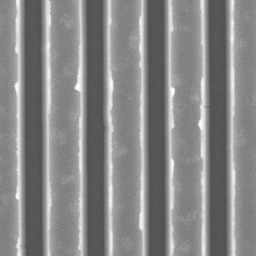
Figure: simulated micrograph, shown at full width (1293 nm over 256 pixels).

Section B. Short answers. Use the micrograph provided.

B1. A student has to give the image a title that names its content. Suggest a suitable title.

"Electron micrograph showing one or a few lines or trenches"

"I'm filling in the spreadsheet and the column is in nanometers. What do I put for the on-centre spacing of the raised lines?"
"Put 309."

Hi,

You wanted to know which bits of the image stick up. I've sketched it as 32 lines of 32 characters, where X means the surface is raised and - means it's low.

XXX---XXXX---XXXXX---XXXXX---XXX
XXX---XXXX---XXXXX---XXXXX---XXX
XXX---XXXX---XXXXX---XXXXX---XXX
XXX---XXXX---XXXXX---XXXXX---XXX
XXX---XXXX---XXXXX---XXXXX---XXX
XXX---XXXX---XXXXX---XXXXX---XXX
XXX---XXXX---XXXXX---XXXXX---XXX
XXX---XXXX---XXXXX---XXXXX---XXX
XXX---XXXX---XXXXX---XXXXX---XXX
XXX---XXXX---XXXXX---XXXXX---XXX
XXX---XXXX---XXXXX---XXXXX---XXX
XXX---XXXX---XXXXX---XXXXX---XXX
XXX---XXXX---XXXXX---XXXXX---XXX
XXX---XXXX---XXXXX---XXXXX---XXX
XXX---XXXX---XXXXX---XXXXX---XXX
XXX---XXXX---XXXXX---XXXXX---XXX
XXX---XXXX---XXXXX---XXXXX---XXX
XXX---XXXX---XXXXX---XXXXX---XXX
XXX---XXXX---XXXXX---XXXXX---XXX
XXX---XXXX---XXXXX---XXXXX---XXX
XXX---XXXX---XXXXX---XXXXX---XXX
XXX---XXXX---XXXXX---XXXXX---XXX
XXX---XXXX---XXXXX---XXXXX---XXX
XXX---XXXX---XXXXX---XXXXX---XXX
XXX---XXXXX--XXXXX---XXXXX---XXX
XXX---XXXXX--XXXXX---XXXXX---XXX
XXX---XXXXX--XXXXX---XXXXX---XXX
XXX---XXXXX--XXXXX---XXXXX---XXX
XXX---XXXXX--XXXXX---XXXXX---XXX
XXX---XXXXX--XXXXX---XXXXX---XXX
XXX---XXXXX--XXXXX---XXXXX---XXX
XXX---XXXXX--XXXXX---XXXXX---XXX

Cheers